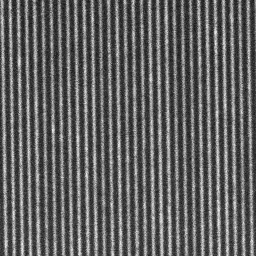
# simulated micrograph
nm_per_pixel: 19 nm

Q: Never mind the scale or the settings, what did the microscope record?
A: parallel lines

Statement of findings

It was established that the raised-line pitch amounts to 8.2 pixels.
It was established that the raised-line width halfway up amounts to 35.5 nanometers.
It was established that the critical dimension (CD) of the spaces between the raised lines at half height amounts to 0.121 um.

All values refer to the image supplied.